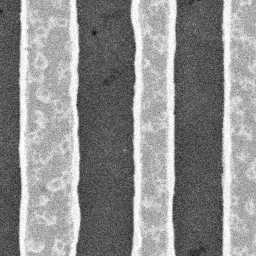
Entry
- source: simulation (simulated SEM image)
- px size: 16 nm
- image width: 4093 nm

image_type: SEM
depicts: one or a few lines or trenches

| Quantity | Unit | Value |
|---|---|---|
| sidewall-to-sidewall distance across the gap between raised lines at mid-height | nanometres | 944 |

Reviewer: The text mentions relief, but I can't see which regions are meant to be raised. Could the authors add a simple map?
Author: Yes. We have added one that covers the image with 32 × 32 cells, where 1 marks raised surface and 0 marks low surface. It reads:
00011111100000000111100000001111
00011111100000000111100000001111
00011111100000000111100000001111
00011111100000000111100000001111
00011111100000000111100000000111
00011111100000000111100000000111
00011111100000000111100000000111
00011111100000000111100000001111
00011111100000000111100000001111
00011111100000000111100000001111
00011111100000000111100000001111
00011111100000000111100000001111
00011111100000000111100000001111
00011111100000000111100000001111
00011111100000000111100000001111
00011111100000000111100000001111
00011111100000000111100000001111
00011111100000000111100000001111
00011111110000000111100000000111
00011111110000000111100000000111
00011111110000000111100000000111
00011111100000000111100000000111
00011111100000000111100000000111
00011111100000000111100000001111
00011111100000000111100000001111
00011111110000000111100000001111
00011111110000000111100000001111
00011111110000000111100000001111
00011111100000000111100000001111
00011111100000000111100000001111
00011111100000000111100000001111
00011111100000000111100000001111